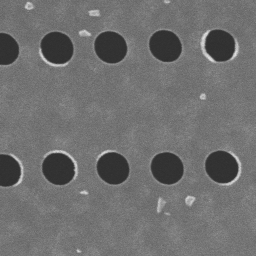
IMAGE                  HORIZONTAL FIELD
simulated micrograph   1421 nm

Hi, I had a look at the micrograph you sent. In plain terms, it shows a regular array of holes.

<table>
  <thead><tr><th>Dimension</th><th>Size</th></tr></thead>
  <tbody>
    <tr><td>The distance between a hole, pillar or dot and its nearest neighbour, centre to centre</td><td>0.301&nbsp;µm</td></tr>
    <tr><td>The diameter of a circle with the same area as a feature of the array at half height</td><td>0.181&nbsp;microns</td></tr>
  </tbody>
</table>